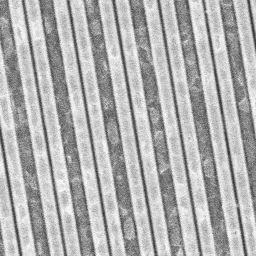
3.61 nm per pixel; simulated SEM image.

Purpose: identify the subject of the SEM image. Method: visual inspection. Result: parallel lines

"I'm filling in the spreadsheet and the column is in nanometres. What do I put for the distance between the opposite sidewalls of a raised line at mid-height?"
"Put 42.3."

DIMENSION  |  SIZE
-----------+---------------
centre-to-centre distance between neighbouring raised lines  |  0.0793 um